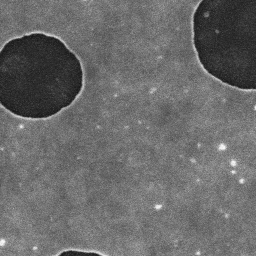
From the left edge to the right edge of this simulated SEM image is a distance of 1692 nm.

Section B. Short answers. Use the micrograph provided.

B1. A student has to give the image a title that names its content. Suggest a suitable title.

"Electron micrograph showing holes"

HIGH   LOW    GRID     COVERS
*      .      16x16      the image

************....
************....
*...********....
.....*******....
.....********...
.....**********.
....************
****************
****************
****************
****************
****************
****************
****************
****************
****************